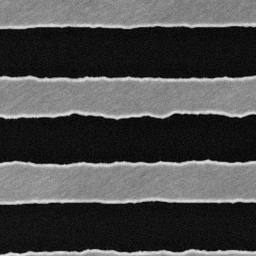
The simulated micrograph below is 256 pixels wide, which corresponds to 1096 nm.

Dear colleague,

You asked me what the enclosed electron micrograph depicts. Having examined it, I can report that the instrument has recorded lines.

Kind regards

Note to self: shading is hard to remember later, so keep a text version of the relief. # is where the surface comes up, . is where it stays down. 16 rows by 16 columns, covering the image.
################
################
................
................
................
################
################
................
................
................
################
################
################
................
................
................